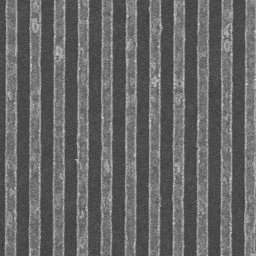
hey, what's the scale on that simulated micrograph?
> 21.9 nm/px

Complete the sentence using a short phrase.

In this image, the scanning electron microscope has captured parallel lines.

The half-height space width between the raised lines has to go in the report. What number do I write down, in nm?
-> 294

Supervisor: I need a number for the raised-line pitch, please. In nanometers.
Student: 525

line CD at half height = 236 nanometers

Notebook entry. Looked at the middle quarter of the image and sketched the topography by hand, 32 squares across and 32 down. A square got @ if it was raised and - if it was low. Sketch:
---@@@---@@@----@@----@@----@@--
---@@@---@@@----@@----@@----@@--
---@@@---@@@----@@----@@----@@--
---@@@---@@@----@@---@@@----@@--
---@@@---@@@----@@---@@@----@@--
----@@---@@@---@@@---@@@----@@--
----@@---@@@---@@@---@@@---@@@--
----@@---@@@---@@@---@@@---@@@--
----@@---@@@---@@@---@@@---@@@--
---@@@---@@@----@@---@@@---@@@--
----@@---@@@---@@@---@@@---@@@--
----@@---@@@---@@@---@@@---@@@--
----@@---@@@---@@@---@@@---@@@--
----@@---@@@---@@@---@@@---@@@--
----@@---@@@---@@@---@@@---@@@--
----@@---@@@---@@@---@@@---@@@--
---@@@---@@@---@@@---@@@---@@@--
---@@@---@@@---@@@---@@@---@@@--
---@@@---@@@---@@@---@@@---@@@--
---@@@---@@@---@@@---@@@---@@@--
---@@@----@@---@@@---@@@---@@@--
----@@----@@---@@@---@@@---@@@--
----@@----@@---@@@---@@@---@@@--
---@@@---@@@---@@@---@@@---@@@--
---@@@---@@@---@@@---@@@---@@@--
---@@@---@@@----@@---@@@---@@@--
---@@@---@@@---@@@---@@@---@@@--
----@@---@@@---@@@---@@@---@@@--
----@@---@@@---@@@---@@@---@@@--
----@@---@@@---@@@---@@@---@@@--
----@@---@@@---@@@---@@@---@@@--
---@@@---@@@---@@@---@@@---@@@--